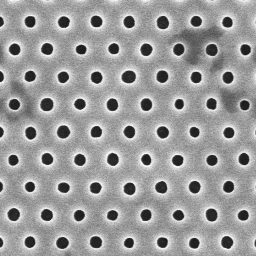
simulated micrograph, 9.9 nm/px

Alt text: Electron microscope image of a regular array of holes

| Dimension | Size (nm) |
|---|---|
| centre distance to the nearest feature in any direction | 313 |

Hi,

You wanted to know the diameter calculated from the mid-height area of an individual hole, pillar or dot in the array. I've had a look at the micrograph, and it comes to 117 nanometers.